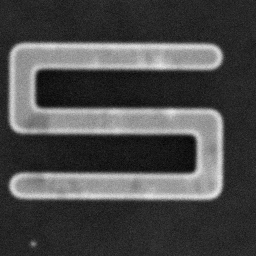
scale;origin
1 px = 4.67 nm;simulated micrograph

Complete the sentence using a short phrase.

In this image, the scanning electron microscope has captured groups of lines, slits or small figures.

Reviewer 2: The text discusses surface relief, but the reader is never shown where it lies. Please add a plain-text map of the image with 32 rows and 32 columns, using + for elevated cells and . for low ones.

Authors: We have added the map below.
................................
................................
................................
................................
................................
................................
..+++++++++++++++++++++++++.....
.+++++++++++++++++++++++++++....
.+++++..+++++++++++++++++++.....
.+++............................
.+++............................
.+++............................
.+++............................
.++++...........................
.++++++++++++++++++++++++++.....
.+++++++++++++++++++++++++++....
...+++++++++++++++++++++++++....
.........................+++....
.........................+++....
.........................+++....
.........................+++....
........................++++....
..++++++++++++++++++++++++++....
.+++++++++++++++++++++++++++....
..+++++++++++++++++++++++++.....
................................
................................
................................
................................
................................
................................
................................